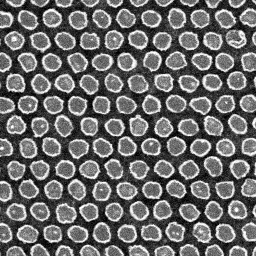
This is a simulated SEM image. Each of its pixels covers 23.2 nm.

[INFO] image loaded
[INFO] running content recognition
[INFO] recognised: a regular array of raised bodies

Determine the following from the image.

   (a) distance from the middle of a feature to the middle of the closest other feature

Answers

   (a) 546 nm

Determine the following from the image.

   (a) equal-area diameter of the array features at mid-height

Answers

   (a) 422 nm